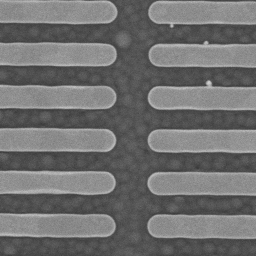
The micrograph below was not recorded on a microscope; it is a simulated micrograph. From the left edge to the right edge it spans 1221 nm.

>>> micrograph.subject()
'groups of lines, slits or small figures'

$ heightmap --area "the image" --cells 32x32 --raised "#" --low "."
##############.....#############
###############....#############
##############.....#############
................................
................................
##########......................
###############....#############
##############.....#############
................................
................................
................................
##############.....#############
##############.....#############
.....##..####......#############
................................
................................
##############.....#############
##############.....#############
##############.....#############
................................
................................
###.......##....................
##############.....#############
##############.....#############
................................
................................
................................
##############.....#############
##############.....#############
...###########.....#############
................................
................................